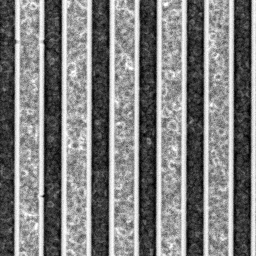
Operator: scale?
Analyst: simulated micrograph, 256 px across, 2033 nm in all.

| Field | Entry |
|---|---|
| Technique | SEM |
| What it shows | parallel lines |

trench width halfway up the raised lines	175	nanometers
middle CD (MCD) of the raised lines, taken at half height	205	nm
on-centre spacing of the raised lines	376	nm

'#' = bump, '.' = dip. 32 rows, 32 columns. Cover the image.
..###...###...###...###...###...
..###...###...###...###...###...
..###...###...###...###...###...
..###...###...###...###...###...
..###...###...###...###...###...
..###...###...###...###...###...
..###...###...###...###...###...
..###...###...###...###...###...
..###...###...###...###...###...
..###...###...###...###...###...
..###...###...###...###...###...
..###...###...###...###...###...
..###...###...###...###...###...
..###...###...###...###...###...
..###...###...###...###...###...
..###...###...###...###...###...
..###...###...###...###...###...
..###...###...###...###...###...
..###...###...###...###...###...
..###...###...###...###...###...
..###...###...###...###...###...
..###...###...###...###...###...
..###...###...###...###...###...
..###...###...###...###...###...
..###...###...###...###...###...
..###...###...###...###...###...
..###...###...###...###...###...
..###...###...###...###...###...
..###...###...###...###...###...
..###...###...###...###...###...
..###...###...###...###...###...
..###...###...###...###...###...